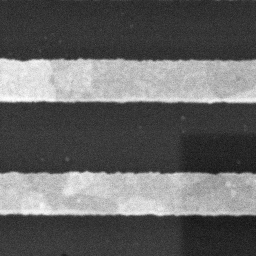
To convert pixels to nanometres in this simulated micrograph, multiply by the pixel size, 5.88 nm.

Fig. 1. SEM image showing lines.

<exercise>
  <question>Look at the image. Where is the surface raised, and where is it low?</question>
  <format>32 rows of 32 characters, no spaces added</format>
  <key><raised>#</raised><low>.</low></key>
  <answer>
................................
................................
................................
................................
................................
................................
................................
#...............................
################################
################################
################################
################################
################################
................................
................................
................................
................................
................................
................................
................................
................................
................................
################################
################################
################################
################################
################################
................................
................................
................................
................................
................................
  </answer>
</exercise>